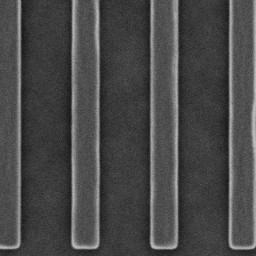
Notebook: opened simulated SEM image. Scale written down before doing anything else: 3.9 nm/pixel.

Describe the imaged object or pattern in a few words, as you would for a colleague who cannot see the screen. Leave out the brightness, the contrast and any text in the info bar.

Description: groups of lines, slits or small figures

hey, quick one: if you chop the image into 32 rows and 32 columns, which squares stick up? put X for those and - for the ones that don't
XXX------XXX-------XXX-------XXX
XXX------XXX-------XXX-------XXX
XX-------XXX-------XXX-------XXX
XX-------XXX-------XXX-------XXX
XX-------XXX-------XXX-------XXX
XX-------XXX-------XXX-------XXX
XXX------XXX-------XXX-------XXX
XXX------XXX-------XXX-------XXX
XXX------XXX-------XXX-------XXX
XXX------XXX-------XXX-------XXX
XXX------XXX-------XXX-------XXX
XX-------XXX-------XXX-------XXX
XX-------XXX-------XXX-------XXX
XX-------XXX-------XXX-------XXX
XX-------XXX-------XXX-------XXX
XX-------XXX-------XXX-------XXX
XX-------XXX-------XXX-------XXX
XX-------XXX-------XXX-------XXX
XX-------XXX-------XXX-------XXX
XX-------XXX-------XXX-------XXX
XX-------XXX-------XXX-------XXX
XX-------XXX-------XXX-------XXX
XX-------XXX-------XXX-------XXX
XX-------XXX-------XXX-------XXX
XX-------XXX-------XXX-------XXX
XX-------XXX-------XXX-------XXX
XX-------XXX-------XXX-------XXX
XX-------XXX-------XXX-------XXX
XX-------XXX-------XXX-------XXX
XX-------XXX-------XXX-------XXX
XX-------XXX-------XXX-------XXX
--------------------------------